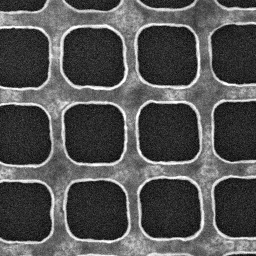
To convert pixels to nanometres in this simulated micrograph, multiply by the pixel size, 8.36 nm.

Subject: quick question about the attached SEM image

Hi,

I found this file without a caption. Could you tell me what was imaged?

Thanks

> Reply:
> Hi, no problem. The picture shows holes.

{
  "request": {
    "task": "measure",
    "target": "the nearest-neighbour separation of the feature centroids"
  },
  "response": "618 nm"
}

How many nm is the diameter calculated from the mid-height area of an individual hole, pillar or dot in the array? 550